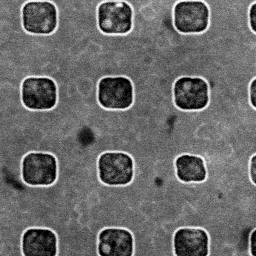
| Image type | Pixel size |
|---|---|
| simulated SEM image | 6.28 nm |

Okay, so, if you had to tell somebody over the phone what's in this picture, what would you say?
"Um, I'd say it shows a regular array of holes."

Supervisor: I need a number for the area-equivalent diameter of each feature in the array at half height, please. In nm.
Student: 228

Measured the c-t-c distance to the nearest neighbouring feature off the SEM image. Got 472 nm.